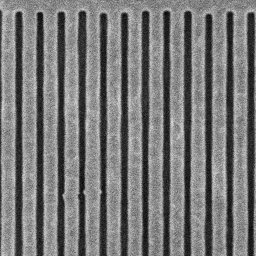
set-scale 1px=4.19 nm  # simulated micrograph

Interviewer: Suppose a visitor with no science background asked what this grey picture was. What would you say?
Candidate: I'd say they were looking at parallel lines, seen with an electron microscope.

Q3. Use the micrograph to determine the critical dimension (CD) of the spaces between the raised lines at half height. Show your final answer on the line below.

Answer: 28.3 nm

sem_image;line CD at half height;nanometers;60.2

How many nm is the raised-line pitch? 88.3